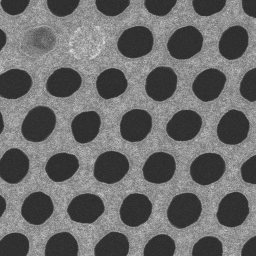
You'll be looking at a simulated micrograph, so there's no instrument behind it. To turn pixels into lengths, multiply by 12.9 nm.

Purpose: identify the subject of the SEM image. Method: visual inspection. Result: a regular array of holes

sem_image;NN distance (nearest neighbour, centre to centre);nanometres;617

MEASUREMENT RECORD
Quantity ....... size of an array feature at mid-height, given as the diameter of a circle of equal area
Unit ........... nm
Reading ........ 425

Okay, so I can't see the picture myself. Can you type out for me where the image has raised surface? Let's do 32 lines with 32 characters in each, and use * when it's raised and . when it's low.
....**....**....**....**....**..
*..***...****..****..****..****.
********************************
****************..*****.*****.**
.**************....**....***...*
.**************....**....**....*
***************....**....***...*
********************************
********************.***********
....**....**....**....***...**..
....**....**....**....**....**..
...***...***...***....**....**..
*******************..****..****.
****..**************************
***....***..***....***...***...*
***....**....**....**....**....*
***...***...***....**....**....*
***..****...****..****..****..**
********************************
...****..***....***..****..*****
....**....**....**....**....**..
...***...***....**....**....**..
*..****.****...***...***...****.
********************************
****..****..****..****...***...*
.**....**....**....**....**....*
***....*.....**....**....**....*
***...***...***...***....**....*
**********************.*********
*..****..****...***..***********
....**....**....**....**....***.
....**....**....**....**....**..